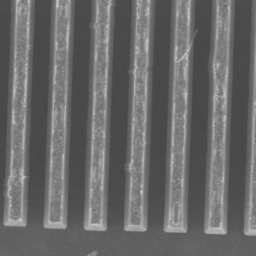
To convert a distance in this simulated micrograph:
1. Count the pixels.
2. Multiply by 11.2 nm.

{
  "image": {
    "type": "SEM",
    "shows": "parallel lines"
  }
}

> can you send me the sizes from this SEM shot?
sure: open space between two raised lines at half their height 270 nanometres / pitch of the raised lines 449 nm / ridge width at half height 186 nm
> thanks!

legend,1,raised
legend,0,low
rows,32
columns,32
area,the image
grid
00110001100011000110001100011000
00110001100011000110001100011000
00110001100011000110001100011000
00110001100011000110001100011000
00110001100011000110001100011000
00110001100011000110001100011000
00110001100011000110001100011000
00110001100011000110001100011000
00110001100011000110001100011000
00110001100011000110001100011000
00110001100010000100001100011000
01100011000010000110001100011000
01100011000010000100001100011000
01100011000010001100011000110001
01100011000110001100011000110001
01100011000110001100011000110001
01100011000110001100011000110001
01100011000110001100011000110001
01100011000110001100011000110001
01100011000110001100011000110001
01100011000110001100011000110001
01100011000110001100011000110001
01100011000110001100011000110001
01100011000110001100011000110001
01100011000110001100011000110001
01100011000110001100011000110001
01100011000110001100011000110001
01100011000110001100011000110001
00000000000000000000011000110001
00000000000000000000000000000000
00000000000000000000000000000000
00000000000000000000000000000000